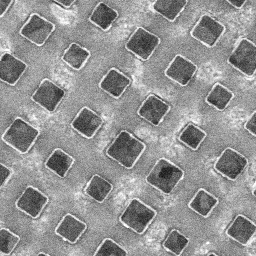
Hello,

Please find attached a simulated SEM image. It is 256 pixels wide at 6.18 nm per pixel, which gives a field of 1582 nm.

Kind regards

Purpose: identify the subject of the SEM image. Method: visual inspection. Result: a regular array of raised bodies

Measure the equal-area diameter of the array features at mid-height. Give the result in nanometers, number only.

173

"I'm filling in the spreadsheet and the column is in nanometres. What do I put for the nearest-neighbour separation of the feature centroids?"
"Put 290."